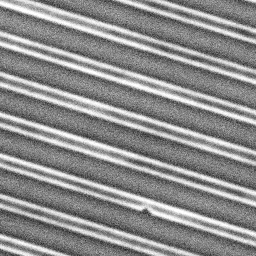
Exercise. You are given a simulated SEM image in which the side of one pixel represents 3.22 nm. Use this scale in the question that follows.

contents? parallel lines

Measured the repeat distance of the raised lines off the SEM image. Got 0.125 micrometres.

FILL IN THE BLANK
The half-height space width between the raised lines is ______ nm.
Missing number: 87.3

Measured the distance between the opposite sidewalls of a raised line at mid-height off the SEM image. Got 38.1 nanometres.